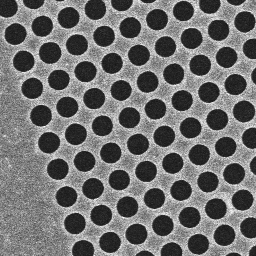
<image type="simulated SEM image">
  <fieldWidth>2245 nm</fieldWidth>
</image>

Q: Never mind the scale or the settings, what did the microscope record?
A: a regular array of holes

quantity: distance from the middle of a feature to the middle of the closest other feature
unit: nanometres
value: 242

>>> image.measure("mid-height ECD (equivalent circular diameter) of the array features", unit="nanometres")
189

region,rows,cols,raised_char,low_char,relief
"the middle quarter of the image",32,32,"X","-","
XXX-----X------XXXXXXXXXXX---XX-
XXX-----XX----XXXXXXXXXXX-----XX
-XX-----XXXXXXXXXXX----XX-----XX
-XX-----XXXXXXXXXX-----XX-----XX
-XXX--XXXXXXX---XX------XX---XXX
-XXXXXXXXXXX-----X-----XXXXXXXXX
XXXXXX---XXX-----XX----XXXXXXXXX
XXXXX-----XX-----XXXXXXXXXX-----
--XXX-----XX----XXXXXXXXXXX-----
---XX-----XXXXXXXXXXX----XX-----
----X----XXXXXXXXXXX-----XX-----
---XXXXXXXXXXXX---XX------XX---X
---XXXXXXXXXXX-----X-----XXXXXXX
XXXXXXXX---XXX-----XX---XXXXXXX-
XXXXXXX-----XX-----XXXXXXXXXX---
X----XX-----XX----XXXXXX--XXX---
------X-----XXXXXXXXXXX----XX---
------XX---XXXXXXX-XXX------X---
------XXXXXXXXXX-----X------XXX-
X----XXXXXXXXXXX-----XX----XXXXX
XXXXXXXXXX----XX-----XXX--XXXXXX
XXXXXXXXX-----XX-----XXXXXXXXXX-
XXX----XX-----XXX---XXXXXX---XX-
XXX-----X-----XXXXXXXXXXX----XX-
XX------XX---XXXXXX---XX------XX
-XX-----XXXXXXXXXX-----XX-----XX
-XXX---XXXXXX--XXX-----XX----XXX
-XXXXXXXXXXX----XX-----XXXXXXXXX
XXXXXXX-XXX-----XX-----XXXXXXXXX
XXXXX----XX-----XXXX-XXXXXXX---X
XXXXX-----XX----XXXXXXXXXXX-----
---X------XXX--XXXXXX---XXX-----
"